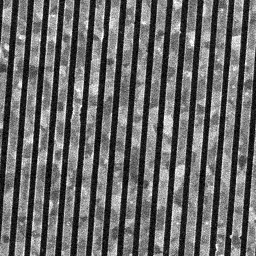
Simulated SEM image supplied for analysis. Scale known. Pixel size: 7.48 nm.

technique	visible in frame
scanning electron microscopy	parallel lines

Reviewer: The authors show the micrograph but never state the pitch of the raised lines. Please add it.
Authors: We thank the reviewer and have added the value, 115 nanometers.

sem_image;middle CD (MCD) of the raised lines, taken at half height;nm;66.2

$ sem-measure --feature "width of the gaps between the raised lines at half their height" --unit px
6.48